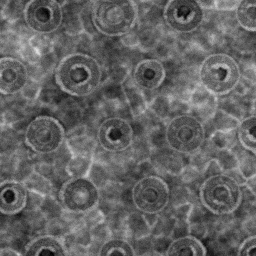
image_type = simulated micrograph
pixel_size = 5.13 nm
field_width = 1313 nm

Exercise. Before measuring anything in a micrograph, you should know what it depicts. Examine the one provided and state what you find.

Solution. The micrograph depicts a regular array of ring-shaped raised bodies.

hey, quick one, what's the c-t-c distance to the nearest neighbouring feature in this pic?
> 69.4 pixels